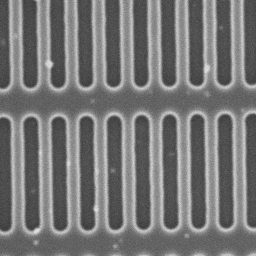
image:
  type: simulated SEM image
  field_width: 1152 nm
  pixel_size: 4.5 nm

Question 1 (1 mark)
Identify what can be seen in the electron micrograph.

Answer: groups of lines, slits or small figures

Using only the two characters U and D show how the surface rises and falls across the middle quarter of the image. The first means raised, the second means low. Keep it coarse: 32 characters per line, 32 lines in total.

DUUDDDDDUUDDDDDUUDDDDUUUDDDDUUUD
DUUDDDDDUUDDDDDUUDDDDUUUDDDDUUUD
DUUDDDDDUUDDDDDUUDDDDUUUDDDDUUUD
DUUDDDDDUUDDDDDUUDDDDUUUDDDDUUUD
DUUUDDDUUUUDDDUUUDDDDUUUDDDDUUUD
UUUUDDDUUUUDDDUUUUDDUUUUUDDUUUUU
UUUUUUUUUUUUUUUUUUUUUUUUUUUUUUUU
UUUUUUUUUUUUUUUUUUUUUUUUUUUUUUUU
UUUUUUUUUUUUUUUUUUUUUUUUUUUUUUUU
UUUUUUUUUUUUUUUUUUUUUUUUUUUUUUUU
UUUUUUUUUUUUUUUUUUUUUUUUUUUUUUUU
UUUUUUUUUUUUUUUUUUUUUUUUUUUUUUUU
UUUUUUUUUUUUUUUUUUUDUUUUUUDUUUUU
UUUUDDDUUUUDDDUUUUDDDUUUUDDDUUUU
DUUUDDDDUUUDDDDUUDDDDDUUDDDDDUUD
DUUUDDDDUUDDDDDUUDDDDDUUDDDDDUUD
DUUUDDDDUUUDDDDUUDDDDDUUDDDDDUUD
DUUUDDDDUUUDDDDUUDDDDDUUDDDDDUUD
DUUUDDDDUUUDDDDUUDDDDDUUDDDDDUUD
DUUUDDDDUUUDDDDUUDDDDDUUDDDDDUUD
DUUUDDDDUUUDDDDUUDDDDDUUDDDDDUUD
DUUUDDDDUUUDDDDUUDDDDDUUDDDDDUUD
DUUUDDDDUUUDDDDUUUDDDDUUDDDDDUUD
DUUUDDDDUUUDDDDUUUDDDDUUDDDDDUUD
DUUUDDDDUUUDDDDUUUDDDDUUDDDDDUUD
DUUUDDDDUUUDDDDUUUDDDDUUDDDDDUUD
DUUUDDDDUUUDDDDUUUDDDDUUDDDDDUUD
DUUUDDDDUUUDDDDUUUDDDDUUDDDDDUUD
DUUUDDDDUUUDDDDUUUDDDDUUDDDDDUUD
DUUUDDDDUUUDDDDUUUDDDDUUDDDDDUUD
DUUUDDDDUUUDDDDUUUDDDDUUUDDDDUUD
DUUUDDDDUUUDDDDUUUDDDDUUUDDDDUUD